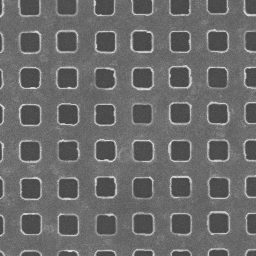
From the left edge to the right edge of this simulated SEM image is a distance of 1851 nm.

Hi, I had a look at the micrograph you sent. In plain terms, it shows a regular array of holes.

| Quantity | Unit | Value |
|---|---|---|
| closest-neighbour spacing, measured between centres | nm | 260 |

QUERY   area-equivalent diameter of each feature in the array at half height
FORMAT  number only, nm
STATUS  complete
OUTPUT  154